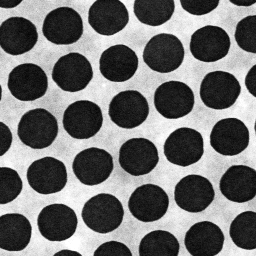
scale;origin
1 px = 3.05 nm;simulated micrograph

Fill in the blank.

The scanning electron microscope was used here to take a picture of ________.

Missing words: a regular array of holes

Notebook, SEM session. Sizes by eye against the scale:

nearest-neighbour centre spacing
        142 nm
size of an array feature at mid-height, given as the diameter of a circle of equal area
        119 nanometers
